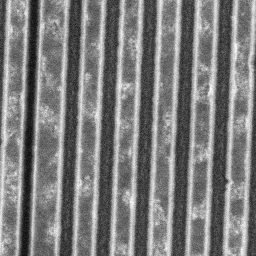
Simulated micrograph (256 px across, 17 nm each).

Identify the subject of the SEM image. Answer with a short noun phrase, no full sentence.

parallel lines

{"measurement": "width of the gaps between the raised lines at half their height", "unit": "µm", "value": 0.296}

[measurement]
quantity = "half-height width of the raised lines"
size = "343 nanometers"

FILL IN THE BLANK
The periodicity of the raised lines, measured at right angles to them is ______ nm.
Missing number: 641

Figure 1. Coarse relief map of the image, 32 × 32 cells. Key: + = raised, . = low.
.+++.+++...++..+++..++...++..+++
.++..+++..+++..+++..++...++..+++
.++..+++..+++..+++..++...++..+++
.++..+++..+++..+++..++...++..+++
.++..+++..+++..+++..++...++..+++
.++..+++..+++..++...++..+++..+++
.++..+++..+++..++...++..+++..+++
.++..+++..+++..++...++..+++..++.
.++..+++..+++..++...++..+++..++.
.++..+++..+++..++...++..+++..++.
.++..+++..+++..++...++..+++..++.
.++..+++..+++..++...++..+++..++.
.++..+++..++...++..+++..+++..++.
.++..+++..++...++..+++..+++..++.
.++.++++..++...++..+++..+++..++.
+++.++++..++...++..+++..+++..++.
+++.++++..++...++..+++..++...++.
+++.++++..++...++..+++..++...++.
+++.++++..++...++..+++..++...++.
+++.++++..++..+++..+++..++...++.
+++.++++..++..+++..+++..++...++.
+++.++++..++..+++..+++..++...++.
+++.++++..++..+++..+++..++...++.
+++.++++..++..+++..++...++..+++.
+++.+++...++..+++..++...++..+++.
+++.+++...++..+++..++...++..+++.
++..+++..+++..+++..++...++..+++.
++..+++..+++..+++..++...++..+++.
++..+++..+++..+++..++...++..+++.
++..+++..+++..+++..++...++..+++.
++..+++..+++..++...++..+++..+++.
++..+++..+++..++...++..+++..+++.